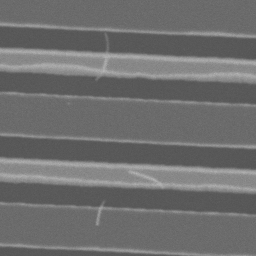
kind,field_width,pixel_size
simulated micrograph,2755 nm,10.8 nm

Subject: lines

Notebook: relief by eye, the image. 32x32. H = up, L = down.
HHHHHHHHHHHHHHHHHHHHHHHHHHHHHHHH
HHHHHHHHHHHHHHHHHHHHHHHHHHHHHHHH
HHHHHHHHHHHHHHHHHHHHHHHHHHHHHHHH
LLLLLLHHHHHHHHHHHHHHHHHHHHHHHHHH
LLLLLLLLLLLLLLLLLLLLLLLLLLLLHHHH
LLLLLLLLLLLLLLLLLLLLLLLLLLLLLLLL
HHHHHHHHHHLLLLLLLLLLLLLLLLLLLLLL
HHHHHHHHHHHHHHHHHHHHHHHHHHHHHHLL
HHHHHHHHHHHHHHHHHHHHHHHHHHHHHHHH
LLLLLLLLLLLLLLLLLLHHHHHHHHHHHHHH
LLLLLLLLLLLLLLLLLLLLLLLLLLLLLLLL
LLLLLLLLLLLLLLLLLLLLLLLLLLLLLLLL
HHHHHHHHHHHHHHHHHHLLLLLLLLLLLLLL
HHHHHHHHHHHHHHHHHHHHHHHHHHHHHHHH
HHHHHHHHHHHHHHHHHHHHHHHHHHHHHHHH
HHHHHHHHHHHHHHHHHHHHHHHHHHHHHHHH
HHHHHHHHHHHHHHHHHHHHHHHHHHHHHHHH
LLLLLLLLLLLHHHHHHHHHHHHHHHHHHHHH
LLLLLLLLLLLLLLLLLLLLLLLLLLLLLLLH
LLLLLLLLLLLLLLLLLLLLLLLLLLLLLLLL
HHHHHHHHHHHHHHLLLLLLLLLLLLLLLLLL
HHHHHHHHHHHHHHHHHHHHHHHHHHHHHHHH
LLLLLHHHHHHHHHHHHHHHHHHHHHHHHHHH
LLLLLLLLLLLLLLLLLLLLLLLLHHHHHHHH
LLLLLLLLLLLLLLLLLLLLLLLLLLLLLLLL
HHHHLLLLLLLLLLLLLLLLLLLLLLLLLLLL
HHHHHHHHHHHHHHHHHHHHHHHHHLLLLLLL
HHHHHHHHHHHHHHHHHHHHHHHHHHHHHHHH
HHHHHHHHHHHHHHHHHHHHHHHHHHHHHHHH
HHHHHHHHHHHHHHHHHHHHHHHHHHHHHHHH
HHHHHHHHHHHHHHHHHHHHHHHHHHHHHHHH
LLLLLLLLLLLLLLLLHHHHHHHHHHHHHHHH